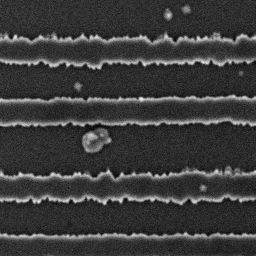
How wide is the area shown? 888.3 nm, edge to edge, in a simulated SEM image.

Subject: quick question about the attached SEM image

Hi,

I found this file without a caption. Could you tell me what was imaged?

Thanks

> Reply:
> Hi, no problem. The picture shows lines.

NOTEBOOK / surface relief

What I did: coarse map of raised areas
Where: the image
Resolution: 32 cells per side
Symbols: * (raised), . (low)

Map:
................................
................................
................................
................................
..............................*.
********************************
********************************
********************************
...........*....................
................................
................................
................................
*****.**************************
********************************
********************************
********.***.***.***..*......***
...........**...................
..........***...................
...........**...................
................................
................................
.............*.........**..**...
********************************
********************************
********************************
................................
................................
................................
................................
********************************
********************************
********************************